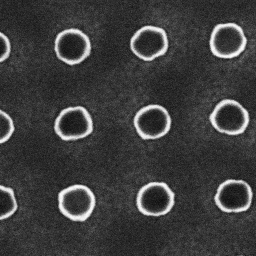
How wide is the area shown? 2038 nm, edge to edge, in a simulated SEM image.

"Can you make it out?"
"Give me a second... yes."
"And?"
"a regular array of raised bodies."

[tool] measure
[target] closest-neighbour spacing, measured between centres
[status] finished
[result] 616 nm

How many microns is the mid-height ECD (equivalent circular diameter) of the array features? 0.267